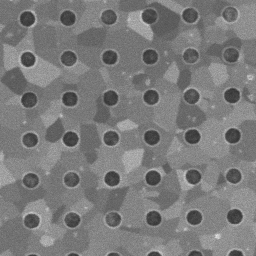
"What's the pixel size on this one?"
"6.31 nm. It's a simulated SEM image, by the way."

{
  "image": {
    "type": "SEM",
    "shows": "a regular array of holes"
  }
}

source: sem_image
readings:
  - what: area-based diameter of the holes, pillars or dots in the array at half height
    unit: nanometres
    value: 103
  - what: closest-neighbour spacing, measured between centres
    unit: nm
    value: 254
